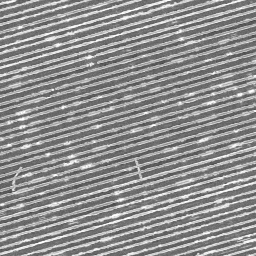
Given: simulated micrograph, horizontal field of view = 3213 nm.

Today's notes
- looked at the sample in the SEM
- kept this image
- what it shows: parallel lines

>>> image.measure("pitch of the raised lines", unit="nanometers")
86.6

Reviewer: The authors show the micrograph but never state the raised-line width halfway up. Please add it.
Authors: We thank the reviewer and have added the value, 24.2 nm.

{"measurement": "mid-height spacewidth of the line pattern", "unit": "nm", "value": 61.9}